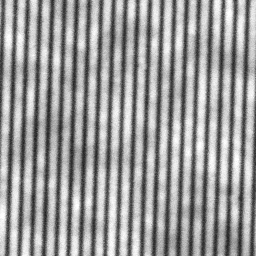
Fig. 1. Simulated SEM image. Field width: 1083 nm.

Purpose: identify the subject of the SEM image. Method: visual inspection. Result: parallel lines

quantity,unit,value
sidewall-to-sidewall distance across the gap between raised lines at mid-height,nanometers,19.6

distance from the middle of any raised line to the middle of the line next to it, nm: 51.8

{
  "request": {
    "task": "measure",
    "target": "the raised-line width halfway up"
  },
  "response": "31.2 nanometers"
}